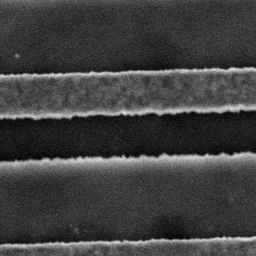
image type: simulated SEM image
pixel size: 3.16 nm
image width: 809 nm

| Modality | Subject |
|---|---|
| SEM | lines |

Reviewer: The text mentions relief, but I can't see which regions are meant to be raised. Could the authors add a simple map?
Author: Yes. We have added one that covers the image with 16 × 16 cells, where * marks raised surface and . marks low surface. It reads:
****************
****************
****************
****************
****************
****************
****************
................
................
................
****************
****************
****************
****************
****************
****************